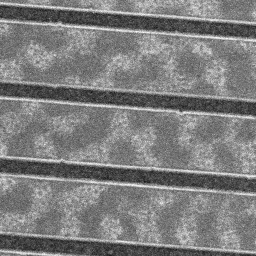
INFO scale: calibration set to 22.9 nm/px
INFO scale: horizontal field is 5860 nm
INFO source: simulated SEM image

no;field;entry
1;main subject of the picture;one or a few lines or trenches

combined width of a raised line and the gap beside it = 1750 nanometers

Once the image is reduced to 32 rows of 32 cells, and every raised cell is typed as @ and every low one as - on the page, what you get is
--@@@@@@@@@@@@@@@@@@@@@@@@@@@@@@
---------------@@@@@@@@@@@@@@@@@
----------------------------@@@@
@@@@@@@@@@@---------------------
@@@@@@@@@@@@@@@@@@@@@@@---------
@@@@@@@@@@@@@@@@@@@@@@@@@@@@@@@@
@@@@@@@@@@@@@@@@@@@@@@@@@@@@@@@@
@@@@@@@@@@@@@@@@@@@@@@@@@@@@@@@@
@@@@@@@@@@@@@@@@@@@@@@@@@@@@@@@@
@@@@@@@@@@@@@@@@@@@@@@@@@@@@@@@@
------@@@@@@@@@@@@@@@@@@@@@@@@@@
-------------------@@@@@@@@@@@@@
@@@-----------------------------
@@@@@@@@@@@@@@@@----------------
@@@@@@@@@@@@@@@@@@@@@@@@@@@@@---
@@@@@@@@@@@@@@@@@@@@@@@@@@@@@@@@
@@@@@@@@@@@@@@@@@@@@@@@@@@@@@@@@
@@@@@@@@@@@@@@@@@@@@@@@@@@@@@@@@
@@@@@@@@@@@@@@@@@@@@@@@@@@@@@@@@
@@@@@@@@@@@@@@@@@@@@@@@@@@@@@@@@
------------@@@@@@@@@@@@@@@@@@@@
-------------------------@@@@@@@
@@@@@@@-------------------------
@@@@@@@@@@@@@@@@@@@@------------
@@@@@@@@@@@@@@@@@@@@@@@@@@@@@@@@
@@@@@@@@@@@@@@@@@@@@@@@@@@@@@@@@
@@@@@@@@@@@@@@@@@@@@@@@@@@@@@@@@
@@@@@@@@@@@@@@@@@@@@@@@@@@@@@@@@
@@@@@@@@@@@@@@@@@@@@@@@@@@@@@@@@
-------@@@@@@@@@@@@@@@@@@@@@@@@@
-------------------@@@@@@@@@@@@@
@@------------------------------